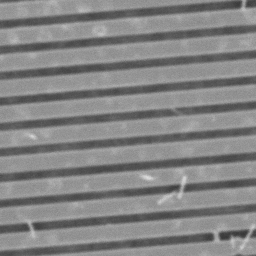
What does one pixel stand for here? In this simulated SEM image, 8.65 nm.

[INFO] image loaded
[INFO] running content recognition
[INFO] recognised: parallel lines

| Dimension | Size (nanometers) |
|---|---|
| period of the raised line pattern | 220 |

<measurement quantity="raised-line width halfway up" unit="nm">143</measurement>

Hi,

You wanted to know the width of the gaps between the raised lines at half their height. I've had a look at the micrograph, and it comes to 0.0764 micrometres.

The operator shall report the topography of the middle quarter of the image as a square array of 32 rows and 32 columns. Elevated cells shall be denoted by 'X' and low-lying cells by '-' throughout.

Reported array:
---------------------------XXXXX
---------------XXXXXXXXXXXXXXXXX
---XXXXXXXXXXXXXXXXXXXXXXXXXXXXX
XXXXXXXXXXXXXXXXXXXXXXXXXXXXXXXX
XXXXXXXXXXXXXXXXXXXXXXXXXX------
XXXXXXXXXXXXXXX-----------------
XXX-----------------------------
---------------------XXXXXXXXXXX
--------XXXXXXXXXXXXXXXXXXXXXXXX
XXXXXXXXXXXXXXXXXXXXXXXXXXXXXXXX
XXXXXXXXXXXXXXXXXXXXXXXXXXXXXXX-
XXXXXXXXXXXXXXXXXXX-------------
XXXXXXX-------------------------
--------------------------XXXXXX
--------------XXXXXXXXXXXXXXXXXX
---XXXXXXXXXXXXXXXXXXXXXXXXXXXXX
XXXXXXXXXXXXXXXXXXXXXXXXXXXXXXXX
XXXXXXXXXXXXXXXXXXXXXXX---------
XXXXXXXXXXX---------------------
------------------------------XX
-------------------XXXXXXXXXXXXX
-------XXXXXXXXXXXXXXXXXXXXXXXXX
XXXXXXXXXXXXXXXXXXXXXXXXXXXXXXXX
XXXXXXXXXXXXXXXXXXXXXXXXXXXXXX--
XXXXXXXXXXXXXXXXXX--------------
XXXXXX--------------------------
-----------------------XXXXXXXXX
-----------XXXXXXXXXXXXXXXXXXXXX
XXXXXXXXXXXXXXXXXXXXXXXXXXXXXXXX
XXXXXXXXXXXXXXXXXXXXXXXXXXXXXXXX
XXXXXXXXXXXXXXXXXXXXXX-------X--
XXXXXXXXXX-------------------X--